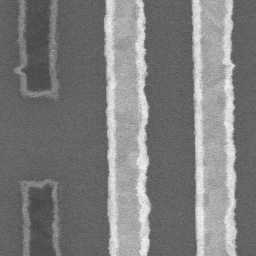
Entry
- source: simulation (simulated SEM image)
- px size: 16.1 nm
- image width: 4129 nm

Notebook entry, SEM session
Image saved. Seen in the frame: one or a few lines or trenches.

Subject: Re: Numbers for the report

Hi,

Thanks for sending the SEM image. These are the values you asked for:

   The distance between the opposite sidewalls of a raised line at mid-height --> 488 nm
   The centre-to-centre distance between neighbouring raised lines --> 1.41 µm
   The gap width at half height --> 915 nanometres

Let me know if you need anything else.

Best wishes